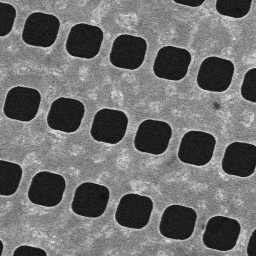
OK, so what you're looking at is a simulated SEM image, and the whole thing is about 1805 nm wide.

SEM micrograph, a regular array of holes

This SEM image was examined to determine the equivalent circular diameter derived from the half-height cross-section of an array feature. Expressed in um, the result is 0.257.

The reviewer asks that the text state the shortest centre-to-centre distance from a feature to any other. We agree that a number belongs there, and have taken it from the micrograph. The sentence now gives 318 nanometres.